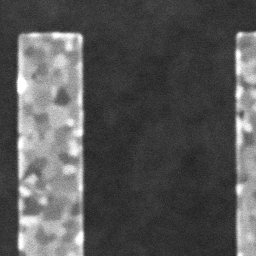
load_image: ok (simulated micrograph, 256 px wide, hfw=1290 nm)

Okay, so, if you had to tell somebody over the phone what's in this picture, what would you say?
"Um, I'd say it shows wiring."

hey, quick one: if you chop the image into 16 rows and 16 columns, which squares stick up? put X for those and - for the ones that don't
----------------
----------------
-XXXX----------X
-XXXX----------X
-XXXX----------X
-XXXX----------X
-XXXX----------X
-XXXX----------X
-XXXX----------X
-XXXX----------X
-XXXX----------X
-XXXX----------X
-XXXX----------X
-XXXX----------X
-XXXX----------X
-XXXX----------X